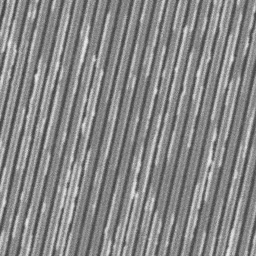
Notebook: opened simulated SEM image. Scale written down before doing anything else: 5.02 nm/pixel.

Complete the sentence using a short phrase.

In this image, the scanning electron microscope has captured parallel lines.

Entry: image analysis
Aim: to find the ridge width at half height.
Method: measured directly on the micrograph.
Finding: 34.3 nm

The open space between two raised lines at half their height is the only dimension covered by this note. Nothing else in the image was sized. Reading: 0.0245 micrometres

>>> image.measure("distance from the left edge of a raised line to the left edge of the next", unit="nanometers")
56.5